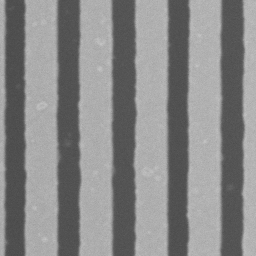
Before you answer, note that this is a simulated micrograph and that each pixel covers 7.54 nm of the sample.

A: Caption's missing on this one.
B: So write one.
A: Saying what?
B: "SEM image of lines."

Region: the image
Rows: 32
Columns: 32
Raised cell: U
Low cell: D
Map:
UDDUUUUDDDUUUUDDDUUUUDDDUUUUDDUU
UDDUUUUDDDUUUUDDDUUUUDDDUUUUDDDU
UDDUUUUDDDUUUUDDDUUUUDDDUUUUDDDU
UDDUUUUDDDUUUUDDDUUUUDDDUUUUDDDU
UDDUUUUDDDUUUUDDDUUUUDDDUUUUDDDU
UDDUUUUDDDUUUUDDDUUUUDDDUUUUDDDU
UDDUUUUDDDUUUUDDDUUUUDDDUUUUDDDU
UDDUUUUDDDUUUUDDDUUUUDDDUUUUDDDU
UDDUUUUDDDUUUUDDDUUUUDDDUUUUDDDU
UDDUUUUDDDUUUUDDDUUUUDDDUUUUDDUU
UDDUUUUDDDUUUUDDDUUUUDDDUUUUDDUU
UDDUUUUDDDUUUUDDDUUUUDDUUUUUDDUU
UDDUUUUDDDUUUUDDDUUUUDDUUUUUDDUU
UDDUUUUDDDUUUUDDDUUUUDDUUUUUDDUU
UDDUUUUDDDUUUUDDDUUUUDDUUUUUDDUU
UDDUUUUDDDUUUUDDDUUUUDDDUUUUDDDU
UDDUUUUDDDUUUUDDDUUUUDDUUUUUDDDU
UDDUUUUDDDUUUUDDDUUUUDDDUUUUDDUU
UDDUUUUDDDUUUUDDDUUUUDDDUUUUDDUU
UDDUUUUDDDUUUUDDDUUUUDDDUUUUDDDU
UDDUUUUDDDUUUUDDDUUUUDDDUUUUDDUU
UDDUUUUDDDUUUUDDDUUUUDDUUUUUDDDU
UDDUUUUDDDUUUUDDDUUUUDDUUUUUDDDU
UDDUUUUDDDUUUUDDDUUUUDDUUUUUDDUU
UDDUUUUDDDUUUUDDDUUUUDDUUUUUDDUU
UDDUUUUDDDUUUUDDDUUUUDDUUUUUDDUU
UDDUUUUDDDUUUUDDDUUUUDDUUUUUDDUU
UDDUUUUDDDUUUUDDDUUUUDDUUUUUDDUU
UDDUUUUDDDUUUUDDDUUUUDDDUUUUDDUU
UDDUUUUDDDUUUUDDDUUUUDDDUUUUDDUU
UDDUUUUDDDUUUUDDDUUUUDDUUUUUDDUU
UDDUUUUDDDUUUUDDDUUUUDDUUUUUDDUU